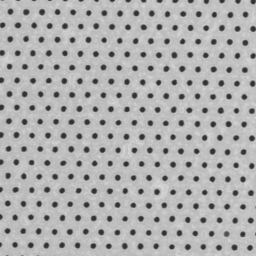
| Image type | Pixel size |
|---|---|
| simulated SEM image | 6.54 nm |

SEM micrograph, a regular array of holes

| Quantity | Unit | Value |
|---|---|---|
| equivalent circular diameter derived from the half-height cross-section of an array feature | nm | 36.9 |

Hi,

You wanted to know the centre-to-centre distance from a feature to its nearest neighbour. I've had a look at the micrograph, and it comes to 0.0996 µm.